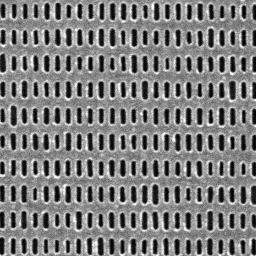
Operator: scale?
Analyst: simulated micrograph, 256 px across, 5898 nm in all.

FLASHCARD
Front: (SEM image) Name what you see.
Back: a regular array of holes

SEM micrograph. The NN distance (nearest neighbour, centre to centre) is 249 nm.